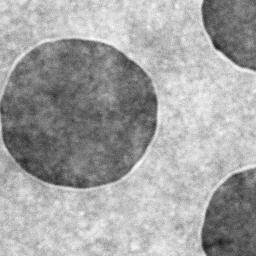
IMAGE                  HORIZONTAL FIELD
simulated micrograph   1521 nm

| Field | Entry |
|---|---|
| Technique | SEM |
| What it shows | holes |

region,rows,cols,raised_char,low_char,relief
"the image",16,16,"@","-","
@@@@@@@@@@@@@---
@@@@@@@@@@@@@---
@@@@--@@@@@@@---
@-------@@@@@@--
@--------@@@@@@@
----------@@@@@@
----------@@@@@@
----------@@@@@@
----------@@@@@@
---------@@@@@@@
@-------@@@@@@@@
@@@----@@@@@@@--
@@@@@@@@@@@@@---
@@@@@@@@@@@@@---
@@@@@@@@@@@@@---
@@@@@@@@@@@@@---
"